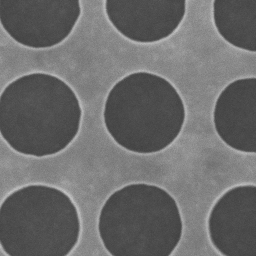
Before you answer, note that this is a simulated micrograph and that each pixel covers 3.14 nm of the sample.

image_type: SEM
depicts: holes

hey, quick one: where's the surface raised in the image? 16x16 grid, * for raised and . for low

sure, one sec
.....**.....*...
.....**....**...
*...****..****..
****************
****************
....***....***..
.....**....***..
.....**....**...
.....**....***..
*...*****.*****.
****************
****************
....***....***..
.....*.....**...
.....*.....**...
.....**....***..